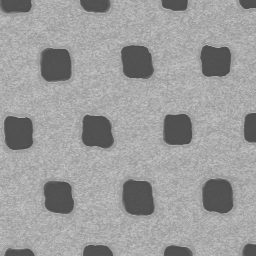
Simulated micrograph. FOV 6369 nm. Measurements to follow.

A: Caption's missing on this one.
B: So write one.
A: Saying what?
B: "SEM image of a regular array of holes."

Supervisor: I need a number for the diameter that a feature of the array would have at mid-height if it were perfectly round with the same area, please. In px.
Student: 33.2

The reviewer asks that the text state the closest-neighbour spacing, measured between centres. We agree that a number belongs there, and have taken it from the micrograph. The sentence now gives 1930 nm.